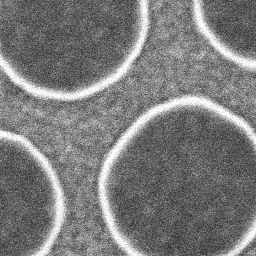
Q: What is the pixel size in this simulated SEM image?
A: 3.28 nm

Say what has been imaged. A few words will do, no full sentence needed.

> raised bodies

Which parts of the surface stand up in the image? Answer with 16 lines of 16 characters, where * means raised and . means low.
*********...****
*********....***
*********....***
********......**
.*******........
..****..........
...........**...
.........******.
*.......********
**.....*********
***....*********
****..**********
****..**********
****...*********
***....*********
***.....*******.